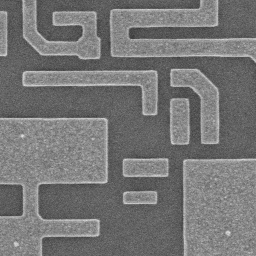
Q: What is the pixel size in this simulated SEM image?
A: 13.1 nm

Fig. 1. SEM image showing wiring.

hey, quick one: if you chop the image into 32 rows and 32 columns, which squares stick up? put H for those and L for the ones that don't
LLLHLLLLLLLLLLLLLLLLLLLLLHHLLLLL
LLLHLLLLLLLLLLHHHHHHHHHHHHHLLLLL
HLLHLLLHHHHHLLHHHHHHHHHHHHHLLLLL
HLLHHLLLLLHHLLHHHLLLLLLLLLLLLLLL
HLLHHLLLLLHHLLHHLLLLLLLLLLLLLLLL
HLLLHHHHHHHHLLHHHHHHHHHHHHHHHHHH
HLLLLHHHHHHHLLHHHHHHHHHHHHHHHHHH
LLLLLLLLLLLLLLLLLLLLLLLLLLLLLLLL
LLLLLLLLLLLLLLLLLLLLLLLLLLLLLLLL
LLLHHHHHHHHHHHHHHHHHLHHHHHLLLLLL
LLLHHHHHHHHHHHHHHHHHLHHHHHHLLLLL
LLLLLLLLLLLLLLLLLLHHLLLLHHHLLLLL
LLLLLLLLLLLLLLLLLLHHLLHLLHHLLLLL
LLLLLLLLLLLLLLLLLLHHLHHHLHHLLLLL
LLLLLLLLLLLLLLLLLLLLLHHHLHHLLLLL
HHHHHHHHHHHHHLLLLLLLLHHHLHHLLLLL
HHHHHHHHHHHHHLLLLLLLLHHHLHHLLLLL
HHHHHHHHHHHHHLLLLLLLLHHHLHHLLLLL
HHHHHHHHHHHHHLLLLLLLLLLLLLLLLLLL
HHHHHHHHHHHHHLLLLLLLLLLLLLLLLLLL
HHHHHHHHHHHHHLLHHHHHHLLHHHHHHHHH
HHHHHHHHHHHHHLLHHHHHHLLHHHHHHHHH
HHHHHHHHHHHHHLLLLLLLLLLHHHHHHHHH
LLLHHLLLLLLLLLLLLLLLLLLHHHHHHHHH
LLLHHLLLLLLLLLLHHHHHLLLHHHHHHHHH
LLLHHLLLLLLLLLLLLLLLLLLHHHHHHHHH
LLLHHLLLLLLLLLLLLLLLLLLHHHHHHHHH
HHHHHHLLLLLHLLLLLLLLLLLHHHHHHHHH
HHHHHHHHHHHHLLLLLLLLLLLHHHHHHHHH
HHHHHHHHHHHHLLLLLLLLLLLHHHHHHHHH
HHHHHLLLLLLLLLLLLLLLLLLHHHHHHHHH
HHHHHLLLLLLLLLLLLLLLLLLHHHHHHHHH